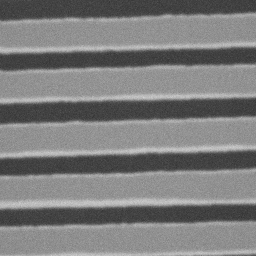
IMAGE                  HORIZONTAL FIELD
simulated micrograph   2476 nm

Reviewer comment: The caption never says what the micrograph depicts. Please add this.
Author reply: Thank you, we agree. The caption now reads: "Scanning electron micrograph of lines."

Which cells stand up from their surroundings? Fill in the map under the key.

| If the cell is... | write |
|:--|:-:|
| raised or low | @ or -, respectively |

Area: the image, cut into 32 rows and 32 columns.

--------------------------------
--------------------------------
------@@@@@@@@@@@@@@@@@@@@@@@@@@
@@@@@@@@@@@@@@@@@@@@@@@@@@@@@@@@
@@@@@@@@@@@@@@@@@@@@@@@@@@@@@@@@
@@@@@@@@@@@@@@@@@@@@@@@@@@@@@@@@
--------------------------------
--------------------------------
-----------------@@@@@@@@@@@@@@@
@@@@@@@@@@@@@@@@@@@@@@@@@@@@@@@@
@@@@@@@@@@@@@@@@@@@@@@@@@@@@@@@@
@@@@@@@@@@@@@@@@@@@@@@@@@@@@@@@@
@@@@@@--------------------------
--------------------------------
--------------------------------
-----@@@@@@@@@@@@@@@@@@@@@@@@@@@
@@@@@@@@@@@@@@@@@@@@@@@@@@@@@@@@
@@@@@@@@@@@@@@@@@@@@@@@@@@@@@@@@
@@@@@@@@@@@@@@@@@@@@@@@@@@@@@@@@
@@------------------------------
--------------------------------
-------------------@--@@@@@@@@@@
@@@@@@@@@@@@@@@@@@@@@@@@@@@@@@@@
@@@@@@@@@@@@@@@@@@@@@@@@@@@@@@@@
@@@@@@@@@@@@@@@@@@@@@@@@@@@@@@@@
@@@@@@@@@@@@@@------------------
--------------------------------
--------------------------------
@@@@@@@@@@@@@@@@@@@@@@@@@@@@@@@@
@@@@@@@@@@@@@@@@@@@@@@@@@@@@@@@@
@@@@@@@@@@@@@@@@@@@@@@@@@@@@@@@@
@@@@@@@@@@@@@@@@@@@@@@@@@@@@@@@@